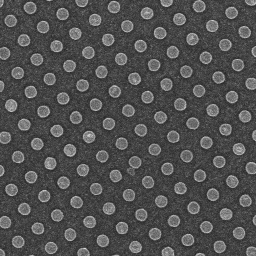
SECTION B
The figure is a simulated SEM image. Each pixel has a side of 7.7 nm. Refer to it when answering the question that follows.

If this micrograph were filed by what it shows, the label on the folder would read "a regular array of raised bodies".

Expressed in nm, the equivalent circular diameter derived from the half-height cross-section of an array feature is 93.1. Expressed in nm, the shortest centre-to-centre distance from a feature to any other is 178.